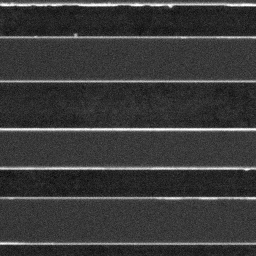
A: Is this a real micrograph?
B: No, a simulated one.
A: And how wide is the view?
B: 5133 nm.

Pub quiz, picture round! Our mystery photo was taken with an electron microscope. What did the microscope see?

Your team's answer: lines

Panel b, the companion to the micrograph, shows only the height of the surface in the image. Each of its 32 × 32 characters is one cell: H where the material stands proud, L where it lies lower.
HHHHHHHHHHHHHHHHHHHHHHHHHHHHHHHH
LLLLLLLLLLLLLLLLLLLLLLLLLLLLLLLL
LLLLLLLLLLLLLLLLLLLLLLLLLLLLLLLL
LLLLLLLLLLLLLLLLLLLLLLLLLLLLLLLL
LLLLLLLLLLLLLLLLLLLLLLLLLLLLLLLL
HHHHHHHHHHHHHHHHHHHHHHHHHHHHHHHH
HHHHHHHHHHHHHHHHHHHHHHHHHHHHHHHH
HHHHHHHHHHHHHHHHHHHHHHHHHHHHHHHH
HHHHHHHHHHHHHHHHHHHHHHHHHHHHHHHH
HHHHHHHHHHHHHHHHHHHHHHHHHHHHHHHH
LLLLLLLLLLLLLLLLLLLLLLLLLLLLLLLL
LLLLLLLLLLLLLLLLLLLLLLLLLLLLLLLL
LLLLLLLLLLLLLLLLLLLLLLLLLLLLLLLL
LLLLLLLLLLLLLLLLLLLLLLLLLLLLLLLL
LLLLLLLLLLLLLLLLLLLLLLLLLLLLLLLL
LLLLLLLLLLLLLLLLLLLLLLLLLLLLLLLL
HHHHHHHHHHHHHHHHHHHHHHHHHHHHHHHH
HHHHHHHHHHHHHHHHHHHHHHHHHHHHHHHH
HHHHHHHHHHHHHHHHHHHHHHHHHHHHHHHH
HHHHHHHHHHHHHHHHHHHHHHHHHHHHHHHH
HHHHHHHHHHHHHHHHHHHHHHHHHHHHHHHH
LLLLLLLLLLLLLLLLLLLLLLLLLLLLLLLL
LLLLLLLLLLLLLLLLLLLLLLLLLLLLLLLL
LLLLLLLLLLLLLLLLLLLLLLLLLLLLLLLL
LLLLLLLLLLLLLLLLLLLLLLLLLLLLLLLL
HHHHHHHHHHHHHHHHHHHHHHHHHHHHHHHH
HHHHHHHHHHHHHHHHHHHHHHHHHHHHHHHH
HHHHHHHHHHHHHHHHHHHHHHHHHHHHHHHH
HHHHHHHHHHHHHHHHHHHHHHHHHHHHHHHH
HHHHHHHHHHHHHHHHHHHHHHHHHHHHHHHH
LLLLLLLLLLLLLLLLLLLLLLLLLLLLLLLL
LLLLLLLLLLLLLLLLLLLLLLLLLLLLLLLL